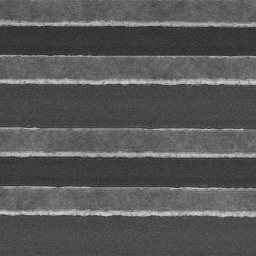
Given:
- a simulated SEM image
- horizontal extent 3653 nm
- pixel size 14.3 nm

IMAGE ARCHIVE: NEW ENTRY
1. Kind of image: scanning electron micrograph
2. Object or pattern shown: lines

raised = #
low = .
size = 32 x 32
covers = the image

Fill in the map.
################################
################################
################################
................................
................................
................................
................................
################################
################################
################################
....................##........#.
................................
................................
................................
................................
................................
################################
################################
################################
................#.....##########
................................
................................
................................
###########.....................
################################
################################
################################
................................
................................
................................
................................
................................